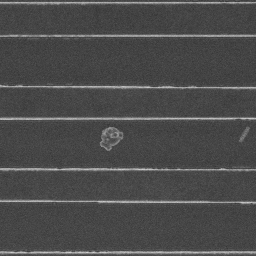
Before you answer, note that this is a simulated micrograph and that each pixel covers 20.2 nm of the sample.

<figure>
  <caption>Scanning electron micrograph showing lines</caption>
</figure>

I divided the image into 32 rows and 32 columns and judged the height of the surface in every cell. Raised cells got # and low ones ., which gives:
################################
################################
################################
################################
................................
................................
................................
................................
................................
................................
................................
################################
################################
################################
################################
................................
.............#..................
................................
................................
................................
................................
################################
################################
################################
################################
................................
................................
................................
................................
................................
................................
................................